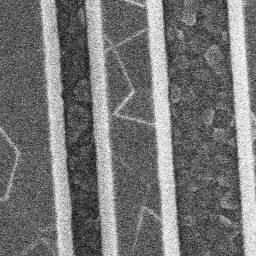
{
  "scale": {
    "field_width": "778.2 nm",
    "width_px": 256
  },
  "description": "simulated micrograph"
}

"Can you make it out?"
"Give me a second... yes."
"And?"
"one or a few lines or trenches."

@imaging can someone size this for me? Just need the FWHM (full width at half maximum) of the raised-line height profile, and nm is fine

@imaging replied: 186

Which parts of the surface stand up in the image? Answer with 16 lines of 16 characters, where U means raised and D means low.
UUUDDDUUUUDDDDDU
UUUDDDUUUUDDDDDU
UUUDDDUUUUDDDDDU
UUUDDDUUUUDDDDDU
UUUDDDUUUUDDDDDU
UUUDDDUUUUDDDDDU
UUUDDDUUUUDDDDDU
UUUDDDUUUUDDDDDU
UUUUDDUUUUDDDDDU
UUUUDDUUUUDDDDDU
UUUUDDDUUUDDDDDU
UUUUDDDUUUDDDDDU
UUUUDDDUUUUDDDDD
UUUUDDDUUUUDDDDD
UUUUDDDUUUUDDDDD
UUUUDDDUUUUDDDDD